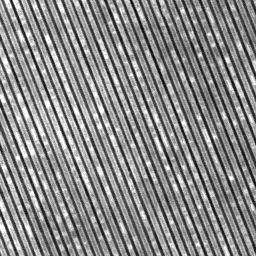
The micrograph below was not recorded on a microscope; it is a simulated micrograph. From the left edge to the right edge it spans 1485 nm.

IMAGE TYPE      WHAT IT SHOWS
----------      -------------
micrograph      parallel lines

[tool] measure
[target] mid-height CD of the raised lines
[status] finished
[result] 27.6 nm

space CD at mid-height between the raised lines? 16.9 nm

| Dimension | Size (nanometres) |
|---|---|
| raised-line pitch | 46.3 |